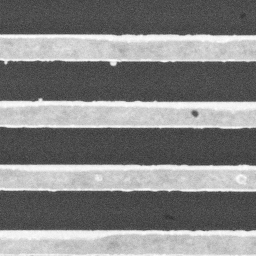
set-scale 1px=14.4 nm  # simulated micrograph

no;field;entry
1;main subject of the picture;lines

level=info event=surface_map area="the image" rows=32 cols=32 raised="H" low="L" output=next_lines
LLLLLLLLLLLLLLLLLLLLLLLLLLLLLLLL
LLLLLLLLLLLLLLLLLLLLLLLLLLLLLLLL
LLLLLLLLLLLLLLLLLLLLLLLLLLLLLLLL
LLLLLLLLLLLLLLLLLLLLLLLLLLLLLLLL
HHHHHHHHHHLLLLLLLLLLLLLLLLLLLLLL
HHHHHHHHHHHHHHHHHHHHHHHHHHHHHHHH
HHHHHHHHHHHHHHHHHHHHHHHHHHHHHHHH
HHHHHHHLHHHHHHHHHHHHHHHHHHHHHHHH
LLLLLLLLLLLLLLLLLLLLLLLLLLLLLLLL
LLLLLLLLLLLLLLLLLLLLLLLLLLLLLLLL
LLLLLLLLLLLLLLLLLLLLLLLLLLLLLLLL
LLLLLLLLLLLLLLLLLLLLLLLLLLLLLLLL
LLLLLLLLLLLLLLLLLLLLLLLLLLLLLLLL
HHHHHHHHHHHHHHHHHHHHHHHHHHHHHHHH
HHHHHHHHHHHHHHHHHHHHHHHHHHHHHHHH
HHHHHHHHHHHHHHHHHHHHHHHHHHHHHHHH
LLLLLLLLLLLLLLLLLLLLLLLLLLLLLLLL
LLLLLLLLLLLLLLLLLLLLLLLLLLLLLLLL
LLLLLLLLLLLLLLLLLLLLLLLLLLLLLLLL
LLLLLLLLLLLLLLLLLLLLLLLLLLLLLLLL
LLLLLLLLLLLLLLLLLLLLLLLLLLLLLLLL
HHHHHHHHHHHHHHHHHHHHHHHHHHHHHHHH
HHHHHHHHHHHHHHHHHHHHHHHHHHHHHHHH
HHHHHHHHHHHHHHHHHHHHHHHHHHHHHHHH
LLLLLLLLLLLLLLLLLLLLLLLLLLLLLLLL
LLLLLLLLLLLLLLLLLLLLLLLLLLLLLLLL
LLLLLLLLLLLLLLLLLLLLLLLLLLLLLLLL
LLLLLLLLLLLLLLLLLLLLLLLLLLLLLLLL
LLLLLLLLLLLLLLLLLLLLLLLLLLLLLLLL
HHHHHHHHHHHHHHHHHHHHHHHHHHHHHHHH
HHHHHHHHHHHHHHHHHHHHHHHHHHHHHHHH
HHHHHHHHHHHHHHHHHHHHHHHHHHHHHHHH